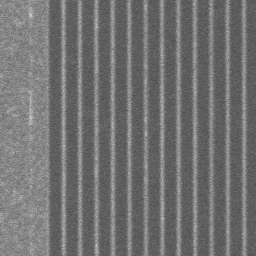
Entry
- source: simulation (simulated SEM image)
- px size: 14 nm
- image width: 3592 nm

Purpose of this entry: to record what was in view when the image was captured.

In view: parallel lines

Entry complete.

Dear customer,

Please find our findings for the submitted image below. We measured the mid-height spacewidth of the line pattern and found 188 nanometers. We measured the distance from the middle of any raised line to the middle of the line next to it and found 230 nanometers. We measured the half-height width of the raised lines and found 40.3 nm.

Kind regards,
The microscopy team